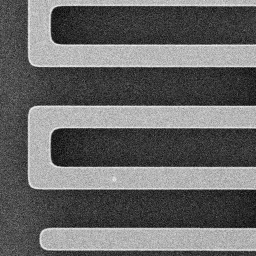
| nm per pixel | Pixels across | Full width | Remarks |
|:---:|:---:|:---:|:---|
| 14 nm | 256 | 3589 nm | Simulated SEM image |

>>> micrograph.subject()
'groups of lines, slits or small figures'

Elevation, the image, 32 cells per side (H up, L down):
LLLLHHHHHHHHHHHHHHHHHHHHHHHHHHHH
LLLLHHLLLLLLLLLLLLLLLLLLLLLLLLLL
LLLLHHLLLLLLLLLLLLLLLLLLLLLLLLLL
LLLLHHLLLLLLLLLLLLLLLLLLLLLLLLLL
LLLLHHLLLLLLLLLLLLLLLLLLLLLLLLLL
LLLLHHHLLLLLLLLLLLLLLLLLLLLLLLLL
LLLLHHHHHHHHHHHHHHHHHHHHHHHHHHHH
LLLLHHHHHHHHHHHHHHHHHHHHHHHHHHHH
LLLLLLLLLLLLLLLLLLLLLLLLLLLLLLLL
LLLLLLLLLLLLLLLLLLLLLLLLLLLLLLLL
LLLLLLLLLLLLLLLLLLLLLLLLLLLLLLLL
LLLLLLLLLLLLLLLLLLLLLLLLLLLLLLLL
LLLLLLLLLLLLLLLLLLLLLLLLLLLLLLLL
LLLLHHHHHHHHHHHHHHHHHHHHHHHHHHHH
LLLLHHHHHHHHHHHHHHHHHHHHHHHHHHHH
LLLLHHHHHHHHHHHHHHHHHHHHHHHHHHHH
LLLLHHHLLLLLLLLLLLLLLLLLLLLLLLLL
LLLLHHLLLLLLLLLLLLLLLLLLLLLLLLLL
LLLLHHLLLLLLLLLLLLLLLLLLLLLLLLLL
LLLLHHLLLLLLLLLLLLLLLLLLLLLLLLLL
LLLLHHHLLLLLLLLLLLLLLLLLLLLLLLLL
LLLLHHHHHHHHHHHHHHHHHHHHHHHHHHHH
LLLLHHHHHHHHHHHHHHHHHHHHHHHHHHHH
LLLLHHHHHHHHHHHHHHHHHHHHHHHHHHHH
LLLLLLLLLLLLLLLLLLLLLLLLLLLLLLLL
LLLLLLLLLLLLLLLLLLLLLLLLLLLLLLLL
LLLLLLLLLLLLLLLLLLLLLLLLLLLLLLLL
LLLLLLLLLLLLLLLLLLLLLLLLLLLLLLLL
LLLLLLLLLLLLLLLLLLLLLLLLLLLLLLLL
LLLLLHHHHHHHHHHHHHHHHHHHHHHHHHHH
LLLLLHHHHHHHHHHHHHHHHHHHHHHHHHHH
LLLLLLLLLLLLLLLLLLLLLLLLLLLLLLLL